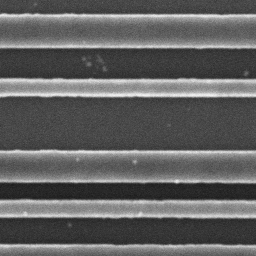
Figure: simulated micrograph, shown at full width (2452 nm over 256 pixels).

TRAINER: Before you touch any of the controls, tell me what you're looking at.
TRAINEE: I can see lines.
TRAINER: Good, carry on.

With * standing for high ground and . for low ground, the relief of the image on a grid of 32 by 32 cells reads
................................
................................
********************************
********************************
********************************
********************************
................................
................................
................................
................................
********************************
********************************
................................
................................
................................
................................
................................
................................
................................
********************************
********************************
********************************
********************************
................................
................................
********************************
********************************
................................
................................
................................
................................
********************************